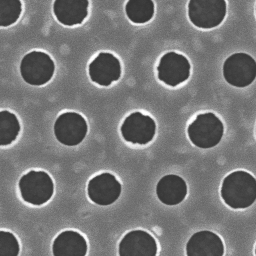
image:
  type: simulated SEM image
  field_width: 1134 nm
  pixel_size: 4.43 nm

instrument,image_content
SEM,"a regular array of holes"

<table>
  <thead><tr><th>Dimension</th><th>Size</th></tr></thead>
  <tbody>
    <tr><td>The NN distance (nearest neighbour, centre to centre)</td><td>300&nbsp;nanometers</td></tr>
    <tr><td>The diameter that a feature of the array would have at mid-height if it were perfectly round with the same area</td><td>33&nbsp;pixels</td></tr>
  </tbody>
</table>